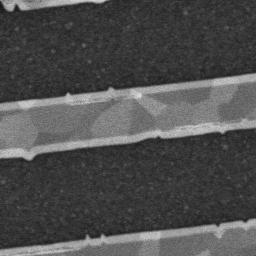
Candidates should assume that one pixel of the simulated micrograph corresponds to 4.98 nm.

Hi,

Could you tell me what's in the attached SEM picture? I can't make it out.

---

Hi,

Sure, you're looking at one or a few lines or trenches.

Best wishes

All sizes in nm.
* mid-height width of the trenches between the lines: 494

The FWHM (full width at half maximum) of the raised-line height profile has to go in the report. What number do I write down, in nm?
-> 229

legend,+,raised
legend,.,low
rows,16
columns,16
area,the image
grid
................
................
................
................
................
..........++++++
..++++++++++++++
++++++++++++++++
+++++++++.......
++..............
................
................
................
................
............++++
...+++++++++++++